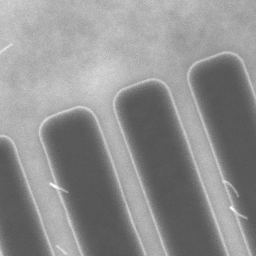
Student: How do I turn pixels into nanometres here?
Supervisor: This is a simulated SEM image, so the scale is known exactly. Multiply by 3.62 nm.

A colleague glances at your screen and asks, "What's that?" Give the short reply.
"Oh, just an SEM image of one or a few lines or trenches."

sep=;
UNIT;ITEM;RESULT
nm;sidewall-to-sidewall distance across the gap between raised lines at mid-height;73.6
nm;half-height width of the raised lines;214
